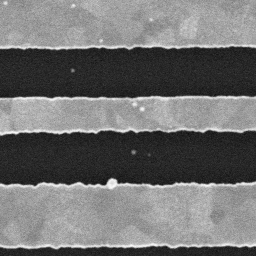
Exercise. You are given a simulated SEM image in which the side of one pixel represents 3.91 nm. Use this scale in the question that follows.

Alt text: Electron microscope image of lines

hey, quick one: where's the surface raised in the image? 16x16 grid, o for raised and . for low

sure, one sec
oooooooooooooooo
oooooooooooooooo
oooooooooooooooo
................
................
................
oooooooooooooooo
oooooooooooooooo
................
................
................
......oo...o.o.o
oooooooooooooooo
oooooooooooooooo
oooooooooooooooo
................